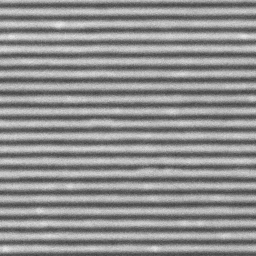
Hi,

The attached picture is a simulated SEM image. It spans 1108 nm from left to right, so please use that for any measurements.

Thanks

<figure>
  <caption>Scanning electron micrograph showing parallel lines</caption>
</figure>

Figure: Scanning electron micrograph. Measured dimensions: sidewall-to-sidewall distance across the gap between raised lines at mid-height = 0.0298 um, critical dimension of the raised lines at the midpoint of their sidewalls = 0.0227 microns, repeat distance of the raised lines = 0.054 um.